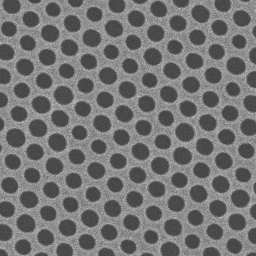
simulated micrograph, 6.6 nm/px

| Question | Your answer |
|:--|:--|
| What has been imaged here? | a regular array of holes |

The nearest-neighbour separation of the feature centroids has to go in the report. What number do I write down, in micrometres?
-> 0.156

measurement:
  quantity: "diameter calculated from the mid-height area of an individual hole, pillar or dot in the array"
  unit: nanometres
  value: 110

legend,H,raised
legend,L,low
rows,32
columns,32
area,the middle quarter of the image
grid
LLHHHLLLHHHHHHHLLLLHHHHHHLLLLHHL
LLLHHHHHHLLLHHHLLLHHHHHHHLLLLHHH
LLLHHHHHHLLLLHHHHHHHLLHHHLLLLHHH
LLHHHLHHHLLLLHHHHHHLLLLHHHLLHHHL
HHHHLLLHHHLLLHHLLHHHLLLHHHHHHHLL
HHHLLLLHHHHHHHLLLLHHLLLHHLLHHHLL
LLHHLLLHHHHHHHLLLLHHHHHHLLLLHHLL
LLHHHHHHHLLLHHLLLLHHHHHHLLLLHHHH
LLHHHHHHLLLLHHHLLHHLLLHHLLLLHHHH
LLHLLHHHLLLLHHHHHHHLLLLHHLLHHHLL
HHHLLLLHHLLLHHLHHHHLLLLHHHHHHLLL
HHHLLLLHHHHHHLLLLHHLLLHHHHHHHLLL
LHHLLLHHHHHHHLLLLHHHHHHHLLLHHHLL
LHHHHHHHLLLHHLLLLHHHHHHLLLLLHHHH
LHHHHHHLLLLLHHHLHHLLLHHHLLLHHHHH
HHHLLHHLLLLLHHHHHHLLLLHHHLHHLLLL
HHLLLLHHLLLHHLLHHHLLLLHHHHHHLLLL
HHLLLLHHHHHHLLLLHHHLLHHHHHHHLLLL
HHHLLHHHHHHHLLLLHHHHHHHLLLHHLLLL
LHHHHHHLLLHHHLLLHHHHHHHLLLLHHHHH
LHHHHHHLLLLHHHHHHLLLLHHLLLLHHHHH
HHLLHHHLLLLHHHHHHLLLLHHHHHHHLLLH
HLLLLHHHHHHHLLHHHLLLLHHHHHHLLLLL
HLLLLHHHHHHHLLLHHHLLLHHLLHHLLLLL
HHLLLHHHHHHLLLLLHHHHHHLLLLHHLLLL
HHHHHHLLLLHHLLLHHHHHHHLLLLHHHHHH
HHHHHHLLLLHHHHHHHLLLHHLLLLHHHHHH
HLLHHHLLLLHHHHHHLLLLHHHLLHHLLLHH
LLLLHHHLLHHHLLHHLLLLHHHHHHHLLLLH
LLLLLHHHHHHLLLLHHLLLHHLLHHHLLLLH
HLLLHHHHHHHLLLLHHHHHHLLLLHHLLLHH
HHHHHHLLLHHHLLHHHHHHHLLLLHHHHHHL